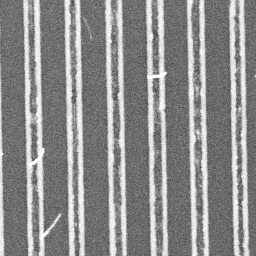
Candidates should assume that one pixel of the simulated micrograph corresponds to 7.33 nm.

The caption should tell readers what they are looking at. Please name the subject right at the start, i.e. parallel lines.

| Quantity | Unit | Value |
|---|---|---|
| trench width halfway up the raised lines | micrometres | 0.207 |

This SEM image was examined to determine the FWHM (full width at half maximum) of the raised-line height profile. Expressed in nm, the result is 90.7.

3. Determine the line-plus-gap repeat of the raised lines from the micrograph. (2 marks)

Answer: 0.3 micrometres